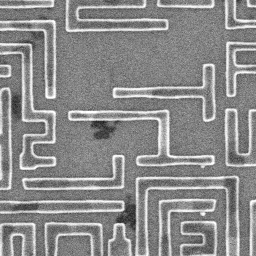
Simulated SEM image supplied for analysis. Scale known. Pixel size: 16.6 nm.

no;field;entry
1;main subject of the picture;wiring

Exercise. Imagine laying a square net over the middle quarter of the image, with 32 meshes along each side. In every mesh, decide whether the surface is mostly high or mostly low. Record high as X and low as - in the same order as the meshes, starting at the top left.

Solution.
--------------------------------
--------------------------------
--------------------------------
--------------------------------
--------------------------------
--------------------------------
-------------XXXXXXXXXXXXXXXXXXX
-------------XXXXXXXXXXXXXXXXXXX
--------------------------------
--------------------------------
--------------------------------
--------------------------------
-XXXXXXXXXXXXXXXXXXXXXXXXX------
-XXXXXXXXXXXXXXXXXXXXXXXXX------
------------------------XX------
------------------------XX------
------------------------XX------
------------------------XX------
------------------------XX------
------------------------XX------
------------------------XX------
------------------------XX------
-----------------------XXX------
------------XXX---XXXXXXXXXXXXXX
------------XXX---XXXXXXXXXXXXXX
------------XXX-----------------
-------------XX-----------------
-------------XX-----------------
------------XXX-----------------
XXXXXXXXXXXXXXX---XXXXXXXXXXXXXX
XXXXXXXXXXXXXXX---XXXXXXXXXXXXXX
------------------XXX-----------